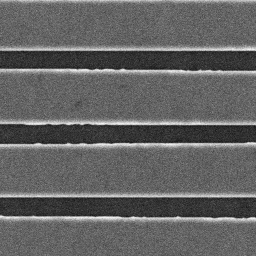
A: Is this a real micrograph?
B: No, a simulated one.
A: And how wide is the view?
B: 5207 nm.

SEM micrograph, lines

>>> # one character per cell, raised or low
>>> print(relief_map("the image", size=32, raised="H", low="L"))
HHHHHHHHHHHHHHHHHHHHHHHHHHHHHHHH
HHHHHHHHHHHHHHHHHHHHHHHHHHHHHHHH
HHHHHHHHHHHHHHHHHHHHHHHHHHHHHHHH
HHHHHHHHHHHHHHHHHHHHHHHHHHHHHHHH
HHHHHHHHHHHHHHHHHHHHHHHHHHHHHHHH
HHHHHHHHHHHHHHHHHHHHHHHHHHHHHHHH
LLLLLLLLLLLLLLLLLLLLLLLLLLLLLLLL
LLLLLLLLLLLLLLLLLLLLLLLLLLLLLLLL
LLLLLLLLLLLLLLLLLLLLLLLLLLLLLLLL
HHHHHHHHHHHHHHHHHHHHHHHHHHHHHHHH
HHHHHHHHHHHHHHHHHHHHHHHHHHHHHHHH
HHHHHHHHHHHHHHHHHHHHHHHHHHHHHHHH
HHHHHHHHHHHHHHHHHHHHHHHHHHHHHHHH
HHHHHHHHHHHHHHHHHHHHHHHHHHHHHHHH
HHHHHHHHHHHHHHHHHHHHHHHHHHHHHHHH
LLLHHLHHHLLLHHHHHHHHHHHHHHHHHHHH
LLLLLLLLLLLLLLLLLLLLLLLLLLLLLLLL
LLLLLLLLLLLLLLLLLLLLLLLLLLLLLLLL
HHHHHHHHHHHHHHHHHHHHHHHHHHHHHHHH
HHHHHHHHHHHHHHHHHHHHHHHHHHHHHHHH
HHHHHHHHHHHHHHHHHHHHHHHHHHHHHHHH
HHHHHHHHHHHHHHHHHHHHHHHHHHHHHHHH
HHHHHHHHHHHHHHHHHHHHHHHHHHHHHHHH
HHHHHHHHHHHHHHHHHHHHHHHHHHHHHHHH
HHHHHHHHHHHHHHHHHHHHHHHHHHHHHHHH
LLLLLLLLLLLLLLLLLLLLLLLLLLLLLLLL
LLLLLLLLLLLLLLLLLLLLLLLLLLLLLLLL
HHHHHHHHHHHHHHHHHHHHHHHHHHHHHHHH
HHHHHHHHHHHHHHHHHHHHHHHHHHHHHHHH
HHHHHHHHHHHHHHHHHHHHHHHHHHHHHHHH
HHHHHHHHHHHHHHHHHHHHHHHHHHHHHHHH
HHHHHHHHHHHHHHHHHHHHHHHHHHHHHHHH